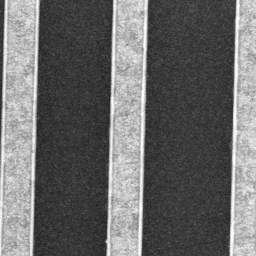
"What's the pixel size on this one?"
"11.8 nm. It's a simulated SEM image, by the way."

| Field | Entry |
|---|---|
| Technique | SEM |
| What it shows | one or a few lines or trenches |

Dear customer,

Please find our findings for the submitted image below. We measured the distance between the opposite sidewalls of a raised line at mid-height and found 364 nanometers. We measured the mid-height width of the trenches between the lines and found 84.6 pixels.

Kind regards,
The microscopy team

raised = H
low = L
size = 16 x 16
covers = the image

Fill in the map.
HHLLLLLHHLLLLLLH
HHLLLLLHHLLLLLLH
HHLLLLLHHLLLLLLH
HHLLLLLHHLLLLLLH
HHLLLLLHHLLLLLLH
HHLLLLLHHLLLLLLH
HHLLLLLHHLLLLLLH
HHLLLLLHHLLLLLLH
HHLLLLLHHLLLLLLH
HHLLLLLHHLLLLLLH
HHLLLLLHHLLLLLLH
HHLLLLLHHLLLLLLH
HHLLLLLHHLLLLLLH
HHLLLLLHHLLLLLLH
HHLLLLLHHLLLLLLH
HHLLLLLHHLLLLLHH